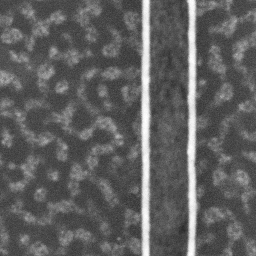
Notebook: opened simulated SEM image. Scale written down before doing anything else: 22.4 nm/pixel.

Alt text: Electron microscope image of one or a few lines or trenches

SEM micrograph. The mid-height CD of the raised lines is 1040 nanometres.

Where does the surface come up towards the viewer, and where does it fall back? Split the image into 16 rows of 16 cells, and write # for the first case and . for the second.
.........###....
.........###....
.........###....
.........###....
.........###....
.........###....
.........###....
.........###....
.........###....
.........###....
.........###....
.........###....
.........###....
.........###....
.........###....
.........###....